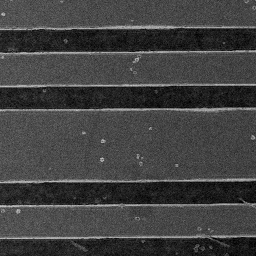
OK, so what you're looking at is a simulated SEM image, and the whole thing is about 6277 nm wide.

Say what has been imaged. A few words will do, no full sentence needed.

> lines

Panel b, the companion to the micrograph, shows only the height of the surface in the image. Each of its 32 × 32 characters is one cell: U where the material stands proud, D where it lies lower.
UUUUUUUUUUUUUUUUUUUUUUUUUUUUUUUU
UUUUUUUUUUUUUUUUUUUUUUUUUUUUUUUU
UUUUUUUUUUUUUUUUUUUUUUUUUUUUUUUU
UUUUUUUUUUUUUUDDDDDDDDDDDDDDDDDD
DDDDDDDDDDDDDDDDDDDDDDDDDDDDDDDD
DDDDDDDDDDDDDDDDDDDDDDDDDDDDDDDD
DDDDDDDDDDDDDDDDDUUUUUUUUUUUUUUU
UUUUUUUUUUUUUUUUUUUUUUUUUUUUUUUU
UUUUUUUUUUUUUUUUUUUUUUUUUUUUUUUU
UUUUUUUUUUUUUUUUUUUUUUUUUUUUUUUU
UUUUUUUUUUUUUUUUUUUUUUUUUUUUUUUU
DDDDDDDDDDDDDDDDDDDDDDDDDDDDDDDD
DDDDDDDDDDDDDDDDDDDDDDDDDDDDDDDD
DDDDDDDDDDDDDDDDDDDDDDDDDDDDDDDD
UUUUUUUUUUUUUUUUUUUUUUUUUUUUUUUU
UUUUUUUUUUUUUUUUUUUUUUUUUUUUUUUU
UUUUUUUUUUUUUUUUUUUUUUUUUUUUUUUU
UUUUUUUUUUUUUUUUUUUUUUUUUUUUUUUU
UUUUUUUUUUUUUUUUUUUUUUUUUUUUUUUU
UUUUUUUUUUUUUUUUUUUUUUUUUUUUUUUU
UUUUUUUUUUUUUUUUUUUUUUUUUUUUUUUU
UUUUUUUUUUUUUUUUUUUUUUUUUUUUUUUU
UUUUUUUUUUUUUUUUUUUUUUUUUUUUUUUU
DDDDDDDDDDDDDDDDDDDDDDDDDDDDDDDD
DDDDDDDDDDDDDDDDDDDDDDDDDDDDDDDD
DDDDDDDDDDDDDDDDDDDDDDDDDDDDDDUD
UUUUUUUUUUUUUUUUUUUUUUUUUUUUUUUU
UUUUUUUUUUUUUUUUUUUUUUUUUUUUUUUU
UUUUUUUUUUUUUUUUUUUUUUUUUUUUUUUU
UUUUUUUUUUUUUUUUUUUUUUUUUUUUUUUU
DDDDDDDDDDDDDDDDDDDDDDDDDDDDDDDD
DDDDDDDDDDDDDDDDDDDDDDDDDDDDDDDD